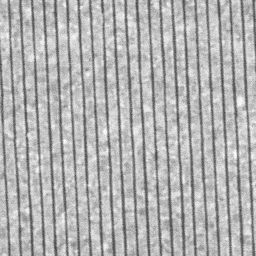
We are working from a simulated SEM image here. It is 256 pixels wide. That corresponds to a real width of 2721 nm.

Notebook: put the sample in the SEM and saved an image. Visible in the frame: parallel lines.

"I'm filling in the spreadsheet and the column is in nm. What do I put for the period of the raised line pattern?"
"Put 124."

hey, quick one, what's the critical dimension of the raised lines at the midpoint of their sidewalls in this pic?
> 8.36 pixels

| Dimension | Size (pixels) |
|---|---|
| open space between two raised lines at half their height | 3.74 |